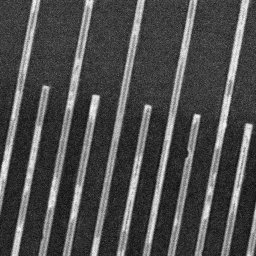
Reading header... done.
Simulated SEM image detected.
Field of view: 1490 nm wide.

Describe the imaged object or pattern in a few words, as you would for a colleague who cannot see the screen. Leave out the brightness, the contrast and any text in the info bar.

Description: parallel lines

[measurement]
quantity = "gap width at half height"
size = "114 nanometers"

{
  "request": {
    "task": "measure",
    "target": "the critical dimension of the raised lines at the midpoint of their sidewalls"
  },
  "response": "35.1 nm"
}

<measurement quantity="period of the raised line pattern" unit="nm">150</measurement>